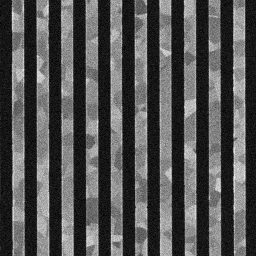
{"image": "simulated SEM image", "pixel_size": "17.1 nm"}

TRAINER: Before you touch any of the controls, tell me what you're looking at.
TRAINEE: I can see parallel lines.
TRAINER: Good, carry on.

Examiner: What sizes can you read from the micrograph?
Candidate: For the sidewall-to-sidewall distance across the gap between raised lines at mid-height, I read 13.4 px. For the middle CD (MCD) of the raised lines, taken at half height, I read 195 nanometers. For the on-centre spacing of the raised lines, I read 421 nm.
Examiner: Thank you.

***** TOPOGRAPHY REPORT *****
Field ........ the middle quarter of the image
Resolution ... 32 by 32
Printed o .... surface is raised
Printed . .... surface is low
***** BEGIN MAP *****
oo....oo....oo....oo....ooo...oo
oo....oo....oo....oo....ooo...oo
oo....oo....oo....oo....ooo...oo
oo....oo....oo....oo....ooo...oo
oo....oo....oo....ooo...ooo...oo
oo....oo....oo....ooo...ooo...oo
oo....oo....oo....ooo...ooo...oo
oo....oo....oo....ooo...ooo...oo
oo....oo....oo....ooo...ooo...oo
oo....oo....oo....ooo...ooo...oo
oo....oo....oo....ooo...ooo...oo
oo....oo....oo....ooo...ooo...oo
oo....oo....oo....ooo...ooo...oo
oo....oo....oo....ooo...ooo...oo
oo....oo....oo....ooo...ooo...oo
oo....oo....oo....ooo...ooo...oo
oo....oo....oo....ooo...ooo...oo
oo....oo....oo....ooo...ooo...oo
oo....oo....oo....ooo...ooo...oo
oo....oo....oo....ooo...ooo...oo
oo....oo....oo....ooo...ooo...oo
oo....oo....oo....ooo...ooo...oo
oo....oo....oo....ooo...ooo...oo
oo....oo....oo....ooo...ooo...oo
oo....oo....oo....ooo...ooo...oo
oo....oo....oo....ooo...ooo...oo
oo....oo....oo....ooo...ooo...oo
oo....oo....oo....ooo...ooo...oo
oo....oo....oo....ooo...ooo...oo
oo....oo....oo....ooo...ooo...oo
oo....oo....oo....ooo...ooo...oo
oo....oo....oo....ooo...ooo...oo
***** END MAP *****